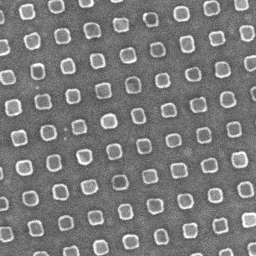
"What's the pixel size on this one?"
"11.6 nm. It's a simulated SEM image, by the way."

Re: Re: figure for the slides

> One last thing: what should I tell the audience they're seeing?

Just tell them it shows a regular array of raised bodies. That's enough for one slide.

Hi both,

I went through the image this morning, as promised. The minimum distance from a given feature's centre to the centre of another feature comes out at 348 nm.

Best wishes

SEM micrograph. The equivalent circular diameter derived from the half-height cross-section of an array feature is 174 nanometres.